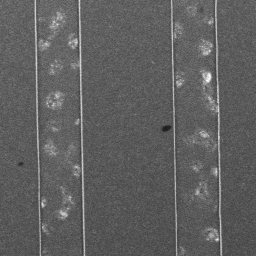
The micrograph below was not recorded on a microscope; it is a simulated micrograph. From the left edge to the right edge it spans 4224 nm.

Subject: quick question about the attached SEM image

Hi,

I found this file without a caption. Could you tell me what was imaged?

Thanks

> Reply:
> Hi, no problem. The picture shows one or a few lines or trenches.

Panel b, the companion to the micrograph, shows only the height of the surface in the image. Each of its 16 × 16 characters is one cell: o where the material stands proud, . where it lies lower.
oo...oooooo..ooo
oo...oooooo..ooo
oo...oooooo...oo
oo...oooooo...oo
oo...oooooo...oo
oo...oooooo...oo
oo...oooooo...oo
oo...oooooo...oo
oo...oooooo...oo
oo...oooooo...oo
oo...oooooo...oo
oo...oooooo...oo
oo...oooooo...oo
oo...oooooo...oo
oo...oooooo...oo
oo...oooooo...oo